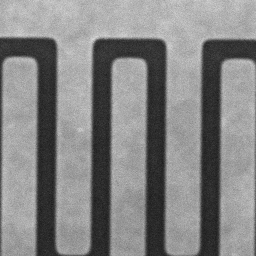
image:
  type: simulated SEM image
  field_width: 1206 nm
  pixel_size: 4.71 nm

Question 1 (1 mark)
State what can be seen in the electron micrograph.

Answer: groups of lines, slits or small figures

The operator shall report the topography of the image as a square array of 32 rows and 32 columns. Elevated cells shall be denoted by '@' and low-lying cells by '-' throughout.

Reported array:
@@@@@@@@@@@@@@@@@@@@@@@@@@@@@@@@
@@@@@@@@@@@@@@@@@@@@@@@@@@@@@@@@
@@@@@@@@@@@@@@@@@@@@@@@@@@@@@@@@
@@@@@@@@@@@@@@@@@@@@@@@@@@@@@@@@
@@@@@@@@@@@@@@@@@@@@@@@@@@@@@@@@
-------@@@@@---------@@@@-------
-------@@@@----------@@@@-------
-@@@---@@@@----@@@---@@@@----@@-
@@@@@--@@@@---@@@@---@@@@---@@@@
@@@@@--@@@@---@@@@---@@@@---@@@@
@@@@@--@@@@---@@@@---@@@@---@@@@
@@@@@--@@@@---@@@@---@@@@---@@@@
@@@@@--@@@@---@@@@---@@@@---@@@@
@@@@@--@@@@---@@@@---@@@@---@@@@
@@@@@--@@@@---@@@@---@@@@---@@@@
@@@@@--@@@@---@@@@---@@@@---@@@@
@@@@@--@@@@---@@@@---@@@@---@@@@
@@@@@--@@@@---@@@@---@@@@---@@@@
@@@@@--@@@@---@@@@---@@@@---@@@@
@@@@@--@@@@---@@@@---@@@@---@@@@
@@@@@--@@@@---@@@@---@@@@---@@@@
@@@@@--@@@@---@@@@---@@@@---@@@@
@@@@@--@@@@---@@@@---@@@@---@@@@
@@@@@--@@@@---@@@@---@@@@---@@@@
@@@@---@@@@---@@@@---@@@@---@@@@
@@@@---@@@@---@@@@---@@@@---@@@@
@@@@---@@@@---@@@@---@@@@---@@@@
@@@@---@@@@---@@@@---@@@@---@@@@
@@@@---@@@@---@@@@---@@@@---@@@@
@@@@---@@@@---@@@@---@@@@---@@@@
@@@@---@@@@---@@@@---@@@@---@@@@
@@@@---@@@@---@@@@---@@@@---@@@@